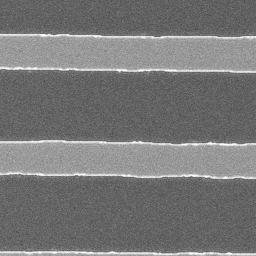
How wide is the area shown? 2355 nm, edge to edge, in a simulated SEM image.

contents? lines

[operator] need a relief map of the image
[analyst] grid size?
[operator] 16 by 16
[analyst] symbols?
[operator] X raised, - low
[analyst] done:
----------------
----------------
XXXXXXXXXXXXXXXX
XXXXXXXXXXXXXXXX
----------------
----------------
----------------
----------------
----------------
XXXXXXXXXXXXXXXX
XXXXXXXXXXXXXXXX
----------------
----------------
----------------
----------------
----------------